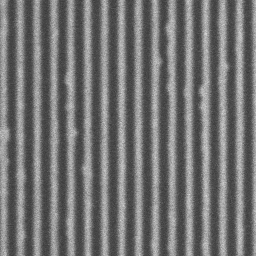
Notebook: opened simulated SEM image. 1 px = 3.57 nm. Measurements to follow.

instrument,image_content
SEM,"parallel lines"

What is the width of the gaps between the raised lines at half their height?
10.5 pixels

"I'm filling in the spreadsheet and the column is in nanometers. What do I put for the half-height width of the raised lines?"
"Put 21.8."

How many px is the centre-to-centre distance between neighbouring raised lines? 16.9